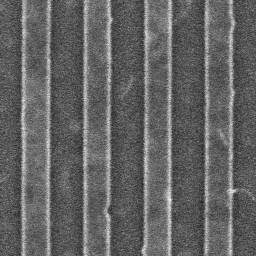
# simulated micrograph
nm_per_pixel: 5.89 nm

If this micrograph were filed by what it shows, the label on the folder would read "one or a few lines or trenches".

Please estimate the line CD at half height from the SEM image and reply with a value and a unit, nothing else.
0.15 um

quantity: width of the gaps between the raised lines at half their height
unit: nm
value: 210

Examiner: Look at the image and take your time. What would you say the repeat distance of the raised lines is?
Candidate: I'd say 0.358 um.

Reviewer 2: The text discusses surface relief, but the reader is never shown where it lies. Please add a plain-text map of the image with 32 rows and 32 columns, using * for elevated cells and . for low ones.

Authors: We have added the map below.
...***.....***....***.....***...
...***.....***....***.....***...
...***.....***....***.....***...
...***.....***....***.....***...
...***.....***....***.....***...
...***.....***....***.....***...
...***.....***....***.....***...
...***.....***....***.....***...
...***.....***....***.....***...
...***.....***....***.....***...
...***.....***....***.....***...
...***.....***....***.....***...
...***.....***....***.....***...
...***.....***....***.....***...
...***.....***....***.....***...
...***.....***....***.....***...
...***.....***....***.....***...
...***.....***....***.....***...
...***.....***....***.....***...
...***.....***....***.....***...
...***.....***....***.....***...
...***.....***....***.....***...
...***.....***....***.....***...
...***.....***....***.....***...
...***.....***....***.....***...
...***.....***....***.....***...
...***.....**.....***.....***...
...***.....***....***.....***...
...***.....***....***.....***...
...***.....***....***.....***...
...***.....***....***.....***...
...***.....***....***.....***...